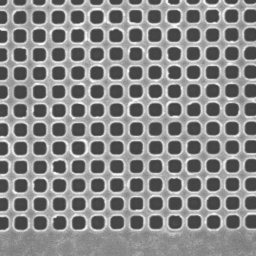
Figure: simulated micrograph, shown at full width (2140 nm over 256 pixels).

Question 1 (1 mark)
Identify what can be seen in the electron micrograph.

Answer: a regular array of holes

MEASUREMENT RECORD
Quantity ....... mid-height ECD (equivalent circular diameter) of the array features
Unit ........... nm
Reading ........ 118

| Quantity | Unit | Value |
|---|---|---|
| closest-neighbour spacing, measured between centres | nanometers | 154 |